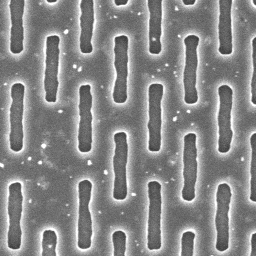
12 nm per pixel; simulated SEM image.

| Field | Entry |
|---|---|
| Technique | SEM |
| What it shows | a regular array of holes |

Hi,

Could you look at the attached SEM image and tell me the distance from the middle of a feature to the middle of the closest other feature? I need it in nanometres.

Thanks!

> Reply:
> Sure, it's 710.